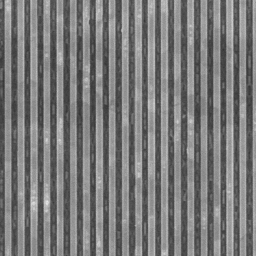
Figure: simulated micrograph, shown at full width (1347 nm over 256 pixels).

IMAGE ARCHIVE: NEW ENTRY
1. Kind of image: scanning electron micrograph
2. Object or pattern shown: parallel lines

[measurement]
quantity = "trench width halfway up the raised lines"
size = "0.0368 micrometres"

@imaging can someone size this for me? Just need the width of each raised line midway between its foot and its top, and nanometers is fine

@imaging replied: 32.2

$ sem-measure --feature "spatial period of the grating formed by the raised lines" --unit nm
68.7